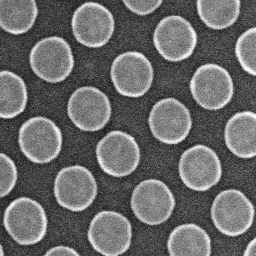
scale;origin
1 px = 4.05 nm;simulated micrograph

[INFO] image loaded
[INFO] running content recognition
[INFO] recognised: a regular array of raised bodies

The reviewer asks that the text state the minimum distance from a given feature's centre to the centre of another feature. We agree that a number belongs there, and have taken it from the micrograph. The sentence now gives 222 nm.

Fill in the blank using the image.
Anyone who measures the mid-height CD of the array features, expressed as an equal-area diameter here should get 174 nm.